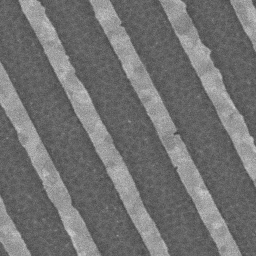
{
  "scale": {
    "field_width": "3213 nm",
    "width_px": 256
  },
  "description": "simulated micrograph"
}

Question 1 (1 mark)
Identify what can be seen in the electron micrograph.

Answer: one or a few lines or trenches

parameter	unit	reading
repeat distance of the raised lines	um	0.787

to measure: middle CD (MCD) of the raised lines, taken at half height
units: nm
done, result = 219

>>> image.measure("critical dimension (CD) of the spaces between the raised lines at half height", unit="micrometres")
0.567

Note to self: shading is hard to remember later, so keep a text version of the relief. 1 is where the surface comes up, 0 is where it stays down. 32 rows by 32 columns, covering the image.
00011000000111000000111000000111
00011000000011000000011000000111
00001100000011100000011100000011
00001110000001100000001100000001
00000110000001110000001110000001
00000111000000110000000110000000
00000011000000111000000111000000
00000011000000011000000011000000
00000001100000011100000011100000
10000001110000001110000001110000
10000000110000001110000001110000
11000000111000000111000000110000
11000000011000000011000000111000
01100000011100000011100000011000
01100000001100000001100000011100
00110000001110000001110000001110
00110000000110000000110000000110
00111000000011000000111000000111
00011100000011000000011000000011
00001100000011100000011100000011
00001110000001110000001100000011
00000110000001110000001110000001
00000111000000111000000110000000
00000011000000011000000111000000
00000011100000011000000011000000
00000001100000001100000011100000
10000001110000001100000001100000
10000000110000000110000001110000
11000000111000000111000000110000
11000000011000000011000000111000
11100000011100000011000000011000
01110000001100000001100000011100